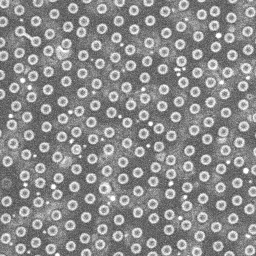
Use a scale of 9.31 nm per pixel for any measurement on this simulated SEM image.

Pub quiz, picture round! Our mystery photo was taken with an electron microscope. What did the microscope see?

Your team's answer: a regular array of raised bodies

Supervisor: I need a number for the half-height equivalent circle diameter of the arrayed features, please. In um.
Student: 0.0866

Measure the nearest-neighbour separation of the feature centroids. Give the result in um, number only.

0.154